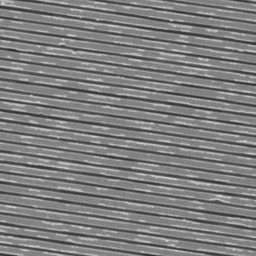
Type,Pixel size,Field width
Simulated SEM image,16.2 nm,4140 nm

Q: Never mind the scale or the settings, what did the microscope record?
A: parallel lines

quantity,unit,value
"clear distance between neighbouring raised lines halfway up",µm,0.058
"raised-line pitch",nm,165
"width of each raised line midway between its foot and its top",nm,102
